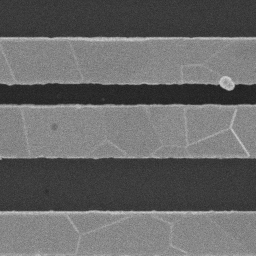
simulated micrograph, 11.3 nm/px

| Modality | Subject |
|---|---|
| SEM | lines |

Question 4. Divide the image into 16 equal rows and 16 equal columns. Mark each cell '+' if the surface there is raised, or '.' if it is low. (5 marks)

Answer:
................
................
++++++++++++++++
++++++++++++++++
++++++++++++++++
..............+.
................
++++++++++++++++
++++++++++++++++
++++++++++++++++
................
................
................
++++++++++++++++
++++++++++++++++
++++++++++++++++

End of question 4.